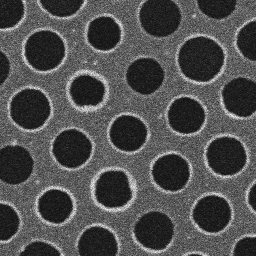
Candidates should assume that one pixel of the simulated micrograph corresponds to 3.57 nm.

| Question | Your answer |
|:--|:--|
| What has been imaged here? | a regular array of holes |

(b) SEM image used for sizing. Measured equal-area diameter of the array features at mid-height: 133 nm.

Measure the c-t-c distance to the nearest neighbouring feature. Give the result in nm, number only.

208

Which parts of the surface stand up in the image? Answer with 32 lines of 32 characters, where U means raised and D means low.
DDDUUDDDDDUUUUUUUUDDDDUUUDDDDDUU
DDDUUUDDDDUUUUUUUDDDDDDUUDDDDUUU
DDDUUUUUUUUUDDUUUUDDDDDUUUUUUUUU
DUUUUUUUUUUDDDDUUUDDDDUUUUUUUUDD
UUUUDDDUUUUDDDDUUUUDDUUUUUUUUUDD
UUUDDDDDUUUDDDDUUUUUUUUDDDDUUUDD
UUUDDDDDUUUUUUUUUUUUUUDDDDDDUUDD
DUUDDDDDUUUUUUUUUDDUUUDDDDDDUUUD
DUUUDDDUUUUUUUUUDDDDUUUDDDDDUUUU
DUUUUUUUUUDUUUUUDDDDDUUDDDDUUUUU
UUUUUUUUUDDDDUUUDDDDUUUUUUUUDDDD
UUDDDUUUUDDDDUUUUDDUUUUUUUUUDDDD
UDDDDDUUUDDDDUUUUUUUUUDDUUUUDDDD
UDDDDDUUUUUUUUUUUUUUUDDDDUUUDDDD
UDDDDDUUUUUUUUUDUUUUUDDDDDUUUUDU
UUDDDUUUUUUUUUDDDDUUUDDDDUUUUUUU
UUUUUUUUDDUUUUDDDDUUUUDDUUUUUUUU
UUUUUUUDDDDUUUDDDDUUUUUUUUUDDDUU
DDDUUUUDDDDUUUUDDUUUUUUUUUDDDDUU
DDDDUUUDDDDUUUUUUUUUDDUUUUDDDDDU
DDDDUUUDDDUUUUUUUUUDDDDUUUDDDDDU
DDDDUUUUUUUUUDDUUUUDDDDDUUUDDDUU
DDDUUUUUUUUUDDDDUUUDDDDUUUUUUUUU
UUUUUUUUUUUUDDDDUUUUDDDUUUUUUUUD
UUUUUDDDDUUUDDDDUUUUUUUUUUDUUUUD
UUUUUDDDDUUUUDDDUUUUUUUUUDDDDUUD
DDUUUDDDDUUUUUUUUUUDUUUUDDDDDUUU
DDUUUUDDUUUUUUUUUDDDDUUUDDDDDUUU
DDUUUUUUUUUDDUUUUDDDDDUUUDDDUUUU
DDUUUUUUUUDDDDUUUDDDDDUUUUUUUUUU
UUUUDDUUUUDDDDDUUUDDDUUUUUUUUUDD
UUUDDDDUUUDDDDDUUUUUUUUUUUUUUDDD